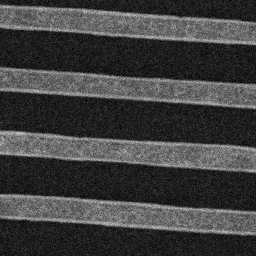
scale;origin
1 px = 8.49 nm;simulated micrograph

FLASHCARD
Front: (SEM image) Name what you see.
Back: one or a few lines or trenches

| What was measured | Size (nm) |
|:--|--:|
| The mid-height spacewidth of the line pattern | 358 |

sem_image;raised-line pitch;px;63.1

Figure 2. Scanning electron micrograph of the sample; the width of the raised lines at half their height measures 21.1 px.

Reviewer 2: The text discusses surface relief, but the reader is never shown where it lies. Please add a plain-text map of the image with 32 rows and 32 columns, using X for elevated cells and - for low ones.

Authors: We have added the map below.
--------------------------------
XXXXXXXXXXXXX-------------------
XXXXXXXXXXXXXXXXXXXXXXXXXX------
---XXXXXXXXXXXXXXXXXXXXXXXXXXXXX
----------------XXXXXXXXXXXXXXXX
--------------------------------
--------------------------------
--------------------------------
--------------------------------
XXXXXXXXXXXX--------------------
XXXXXXXXXXXXXXXXXXXXXXXXXXX-----
------XXXXXXXXXXXXXXXXXXXXXXXXXX
--------------------XXXXXXXXXXXX
--------------------------------
--------------------------------
--------------------------------
--------------------------------
XXXXXXXXXXXXX-------------------
XXXXXXXXXXXXXXXXXXXXXXXXXXXXXX--
-----XXXXXXXXXXXXXXXXXXXXXXXXXXX
--------------------XXXXXXXXXXXX
--------------------------------
--------------------------------
--------------------------------
XX------------------------------
XXXXXXXXXXXXXXXX----------------
XXXXXXXXXXXXXXXXXXXXXXXXXXXXX---
------XXXXXXXXXXXXXXXXXXXXXXXXXX
---------------------XXXXXXXXXXX
--------------------------------
--------------------------------
--------------------------------